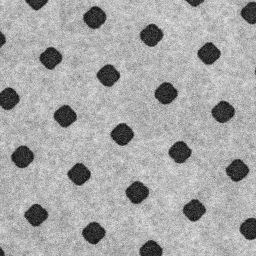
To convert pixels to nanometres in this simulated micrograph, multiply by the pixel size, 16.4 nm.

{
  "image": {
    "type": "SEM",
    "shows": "a regular array of holes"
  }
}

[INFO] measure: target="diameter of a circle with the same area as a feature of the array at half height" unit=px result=22.3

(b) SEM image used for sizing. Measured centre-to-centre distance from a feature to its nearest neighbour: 0.968 micrometres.